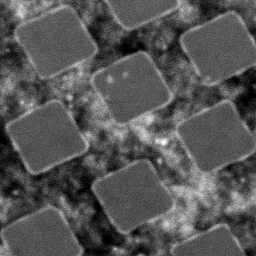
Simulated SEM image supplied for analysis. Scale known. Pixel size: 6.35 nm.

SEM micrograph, raised bodies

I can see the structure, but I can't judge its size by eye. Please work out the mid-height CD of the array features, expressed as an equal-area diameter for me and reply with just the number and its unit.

438 nanometres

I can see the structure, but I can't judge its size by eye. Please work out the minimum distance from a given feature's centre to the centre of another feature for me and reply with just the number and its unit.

0.586 um